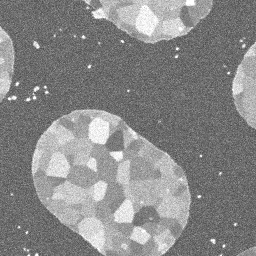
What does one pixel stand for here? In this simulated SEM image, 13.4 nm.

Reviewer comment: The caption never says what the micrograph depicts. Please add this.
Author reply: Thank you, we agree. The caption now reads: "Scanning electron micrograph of raised bodies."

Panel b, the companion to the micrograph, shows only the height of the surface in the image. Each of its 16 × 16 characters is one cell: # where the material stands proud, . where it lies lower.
......#######...
.......#####....
#........#......
#..............#
#..............#
#..............#
...............#
....####.......#
...######.......
..########......
..#########.....
..##########....
...#########....
...#########....
.....######.....
......#####.....